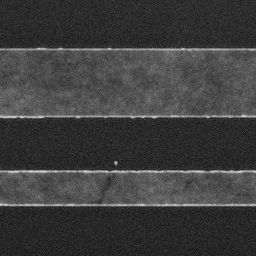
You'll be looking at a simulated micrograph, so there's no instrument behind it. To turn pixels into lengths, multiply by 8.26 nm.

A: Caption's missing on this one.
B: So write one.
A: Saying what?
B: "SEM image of lines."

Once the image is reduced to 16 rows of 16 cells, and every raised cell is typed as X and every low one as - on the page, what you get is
----------------
----------------
----------------
XXXXXXXXXXXXXXXX
XXXXXXXXXXXXXXXX
XXXXXXXXXXXXXXXX
XXXXXXXXXXXXXXXX
----------------
----------------
----------------
----------------
XXXXXXXXXXXXXXXX
XXXXXXXXXXXXXXXX
----------------
----------------
----------------